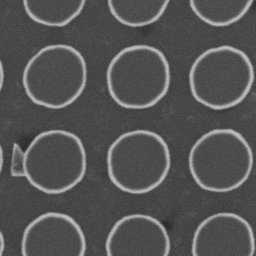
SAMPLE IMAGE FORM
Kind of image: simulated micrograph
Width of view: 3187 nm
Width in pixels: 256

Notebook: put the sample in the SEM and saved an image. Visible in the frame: raised bodies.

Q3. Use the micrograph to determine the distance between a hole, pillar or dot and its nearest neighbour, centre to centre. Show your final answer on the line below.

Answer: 1030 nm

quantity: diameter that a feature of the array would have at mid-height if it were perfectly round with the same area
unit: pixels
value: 61.3